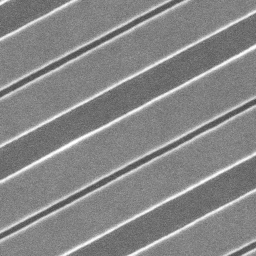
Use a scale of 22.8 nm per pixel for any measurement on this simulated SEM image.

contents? lines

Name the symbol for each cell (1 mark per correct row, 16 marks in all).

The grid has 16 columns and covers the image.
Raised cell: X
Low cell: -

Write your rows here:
----XXXXXXXXXXXX
--XXXXXXXXXXXX--
XXXXXXXXXXXXX---
XXXXXXXXXXX----X
XXXXXXXXX----XXX
XXXXXXX----XXXXX
XXXXX----XXXXXXX
XXX----XXXXXXXXX
X----XXXXXXXXXXX
----XXXXXXXXXXXX
--XXXXXXXXXXXX--
XXXXXXXXXXXX----
XXXXXXXXXXX----X
XXXXXXXXX----XXX
XXXXXXX----XXXXX
XXXXX----XXXXXXX